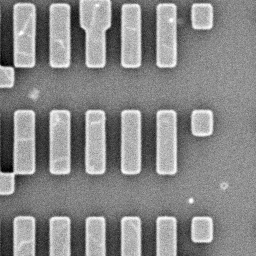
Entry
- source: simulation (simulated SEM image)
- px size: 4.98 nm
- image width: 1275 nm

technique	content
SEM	wiring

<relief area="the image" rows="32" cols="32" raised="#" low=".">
..##......####..................
..##..###.####.###..##..##......
..##..###.####.###..##..##......
..##..###.####.###..##..##......
..##..###..##..###..##..........
..##..###..##..###..##..........
..##..###..##..###..##..........
..##..###..##..###..##..........
#...............................
##..............................
##..............................
................................
................................
................................
..##..###..##..###..##..##......
..##..###..##..###..##..##......
..##..###..##..###..##..##......
..##..###..##..###..##..........
..##..###..##..###..##..........
..##..###..##..###..##..........
..##..###..##..###..##..........
..##...#...##...#...##..........
##..............................
##..............................
................................
................................
................................
..##..###..##..##...##..##......
..##..###..##..###..##..##......
..##..###..##..###..##..##......
..##..###..##..###..##..........
..##..###..##..###..##..........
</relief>